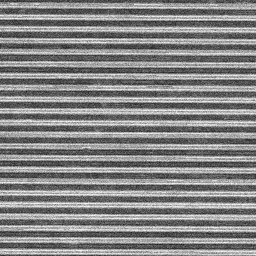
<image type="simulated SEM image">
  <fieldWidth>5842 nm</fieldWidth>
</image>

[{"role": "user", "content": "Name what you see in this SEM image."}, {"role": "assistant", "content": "parallel lines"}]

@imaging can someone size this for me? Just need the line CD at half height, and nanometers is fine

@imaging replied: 111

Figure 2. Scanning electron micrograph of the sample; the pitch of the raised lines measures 0.268 µm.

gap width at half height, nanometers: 154